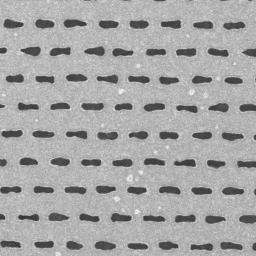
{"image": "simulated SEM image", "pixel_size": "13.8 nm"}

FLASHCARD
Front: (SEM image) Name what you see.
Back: a regular array of holes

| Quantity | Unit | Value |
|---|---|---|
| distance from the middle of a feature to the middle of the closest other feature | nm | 417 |